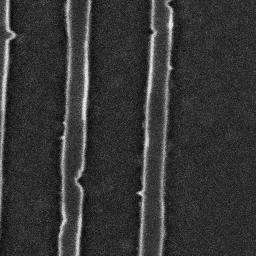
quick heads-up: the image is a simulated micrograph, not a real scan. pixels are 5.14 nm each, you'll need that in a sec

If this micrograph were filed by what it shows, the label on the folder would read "one or a few lines or trenches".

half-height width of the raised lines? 103 nm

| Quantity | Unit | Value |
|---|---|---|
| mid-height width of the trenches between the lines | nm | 318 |